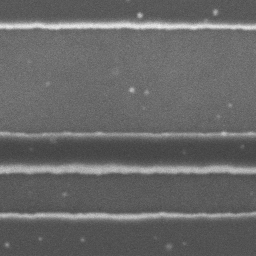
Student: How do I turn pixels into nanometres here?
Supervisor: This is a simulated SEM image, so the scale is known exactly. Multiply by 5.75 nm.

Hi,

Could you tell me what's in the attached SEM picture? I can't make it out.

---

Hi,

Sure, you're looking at lines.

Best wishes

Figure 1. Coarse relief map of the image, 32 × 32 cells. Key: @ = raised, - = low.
@@@@@@@@@@@@@@@@@@@@@@@@@@@@@@@@
@@@@@@@@@@@@@@@@@@@@@@@@@@@@@@@@
@@@@@@@@@@@@@@@@@@@@@@@@@@@@@@@@
------------------------@-----@@
--------------------------------
--------------------------------
--------------------------------
--------------------------------
--------------------------------
--------------------------------
--------------------------------
--------------------------------
--------------------------------
--------------------------------
--------------------------------
--------------------------------
--------------------------------
@@@@@@@@@@@@@@@@@@@@@@@@@@@@@@@@
@@@@@@@@@@@@@@@@@@@@@@@@@@@@@@@@
@@@@@@@@@@@@@@@@@@@@@@@@@@@@@@@@
@@@@@@@@@@@@@@@@@@@@@@@@@@@@@@@@
------------@-----@--@---@---@@@
--------------------------------
--------------------------------
--------------------------------
--------------------------------
--------------------------------
@@@@@@@@@@@@@@@@@@@@@@@@@@@@@@@@
@@@@@@@@@@@@@@@@@@@@@@@@@@@@@@@@
@@@@@@@@@@@@@@@@@@@@@@@@@@@@@@@@
@@@@@@@@@@@@@@@@@@@@@@@@@@@@@@@@
@@@@@@@@@@@@@@@@@@@@@@@@@@@@@@@@